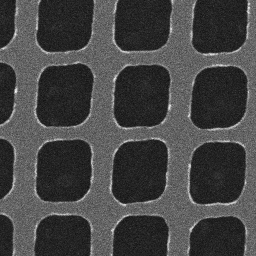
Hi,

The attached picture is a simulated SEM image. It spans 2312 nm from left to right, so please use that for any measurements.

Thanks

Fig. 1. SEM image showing holes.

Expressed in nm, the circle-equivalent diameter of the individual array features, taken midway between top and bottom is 571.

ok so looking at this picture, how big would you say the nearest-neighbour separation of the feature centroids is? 681 nanometres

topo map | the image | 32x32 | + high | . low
..+++.......+++......+++.......+
..+++.......++.......+++.......+
..+++.......++.......+++.......+
..+++.......++.......+++.......+
..+++......+++.......+++.......+
.++++......++++......+++......++
++++++..+++++++++++++++++....+++
++++++++++++++++++++++++++++++++
..++++.....+++++.....+++++....++
..+++.......+++......++++......+
..+++.......++.......+++.......+
..+++......+++.......+++.......+
..+++......+++.......+++.......+
..+++......+++.......+++.......+
.++++......+++.......+++......++
+++++.....+++++.....++++......++
++++++++++++++++++++++++++++++++
.+++++++..++++++++..++++++++++++
..+++......++++......++++.....++
..+++......+++.......+++.......+
..+++......+++.......+++.......+
..+++......+++.......+++.......+
..+++......+++.......+++.......+
..++.......+++.......+++......++
.++++......+++......++++......++
+++++++++++++++++++++++++.++++++
++++++++++++++++++++++++++++++++
.++++......++++......++++.....++
..+++......+++.......+++.......+
..++.......+++.......+++.......+
..++.......+++.......+++.......+
..++.......+++.......+++.......+